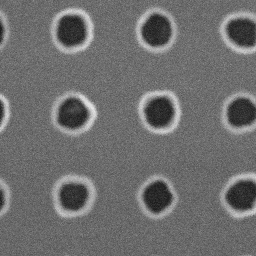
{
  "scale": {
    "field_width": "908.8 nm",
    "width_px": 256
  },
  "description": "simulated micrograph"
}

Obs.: holes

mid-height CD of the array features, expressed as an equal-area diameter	118	nm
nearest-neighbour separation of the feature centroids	291	nm